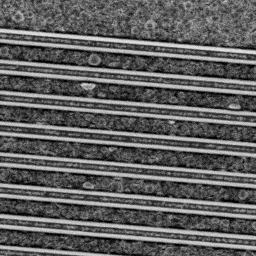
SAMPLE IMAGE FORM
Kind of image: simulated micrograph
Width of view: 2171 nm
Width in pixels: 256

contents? parallel lines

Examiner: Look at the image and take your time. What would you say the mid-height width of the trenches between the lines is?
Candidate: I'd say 177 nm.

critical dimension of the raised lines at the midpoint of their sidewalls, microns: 0.0845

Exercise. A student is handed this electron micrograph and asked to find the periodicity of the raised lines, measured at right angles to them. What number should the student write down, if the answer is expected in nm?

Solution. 261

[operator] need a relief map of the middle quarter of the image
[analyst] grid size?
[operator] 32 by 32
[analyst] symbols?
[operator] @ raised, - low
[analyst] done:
--------------------------------
@@@@@@@-------------------------
@@@@@@@@@@@@@@@@@@@-------------
----@@@@@@@@@@@@@@@@@@@@@@@@@@@-
---------------@@@@@@@@@@@@@@@@@
---------------------------@@@@@
--------------------------------
--------------------------------
@-------------------------------
@@@@@@@@@@-@@-------------------
@@@@@@@@@@@@@@@@@@@@@@@@--------
------@@@@@@@@@@@@@@@@@@@@@@@@@@
------------------@@@@@@@@@@@@@@
-----------------------------@@@
--------------------------------
--------------------------------
@@@@----------------------------
@@@@@@@@@@@@@@@-----------------
@@@@@@@@@@@@@@@@@@@@@@@@@@@-----
---------@@@@@@@@@@@@@@@@@@@@@@@
--------------------@@@@@@@@@@@@
--------------------------------
--------------------------------
--------------------------------
@@@@@@--------------------------
@@@@@@@@@@@@@@@@@@--------------
@@@@@@@@@@@@@@@@@@@@@@@@@@@@@@--
-----------@@@@@@@@@@@@@@@@@@@@@
-----------------------@@@@@@@@@
--------------------------------
--------------------------------
--------------------------------